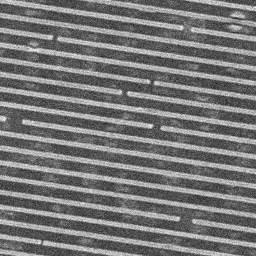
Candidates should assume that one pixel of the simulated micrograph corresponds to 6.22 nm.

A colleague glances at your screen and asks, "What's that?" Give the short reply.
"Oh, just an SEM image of parallel lines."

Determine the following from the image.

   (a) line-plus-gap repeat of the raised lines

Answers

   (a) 90.7 nanometres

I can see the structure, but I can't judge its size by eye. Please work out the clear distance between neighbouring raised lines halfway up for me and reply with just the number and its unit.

67.7 nanometres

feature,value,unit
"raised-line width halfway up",22.3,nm